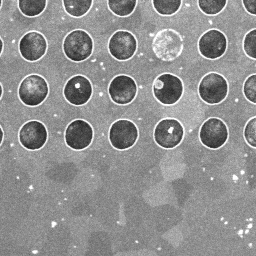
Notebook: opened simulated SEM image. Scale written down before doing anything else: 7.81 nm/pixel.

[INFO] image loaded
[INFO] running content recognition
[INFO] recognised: a regular array of holes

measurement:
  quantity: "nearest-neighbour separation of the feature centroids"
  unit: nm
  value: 345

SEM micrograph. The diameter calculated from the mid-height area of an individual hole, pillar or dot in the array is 229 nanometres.